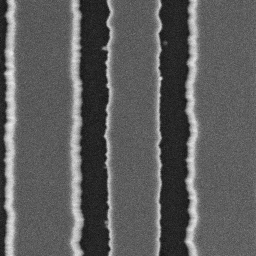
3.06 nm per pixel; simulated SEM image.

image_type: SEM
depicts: lines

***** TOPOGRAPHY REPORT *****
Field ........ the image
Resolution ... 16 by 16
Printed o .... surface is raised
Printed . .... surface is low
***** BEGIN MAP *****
.oooo..ooo..oooo
.oooo..ooo..oooo
ooooo..ooo..oooo
ooooo..ooo..oooo
ooooo..ooo..oooo
ooooo..ooo..oooo
ooooo..ooo..oooo
ooooo..ooo..oooo
ooooo..ooo..oooo
ooooo..ooo..oooo
ooooo..ooo..oooo
ooooo..ooo..oooo
ooooo..ooo..oooo
ooooo..ooo..oooo
ooooo..ooo..oooo
ooooo..ooo..oooo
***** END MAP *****